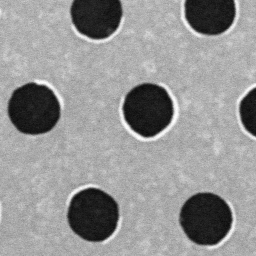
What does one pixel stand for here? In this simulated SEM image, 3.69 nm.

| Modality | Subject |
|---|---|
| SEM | holes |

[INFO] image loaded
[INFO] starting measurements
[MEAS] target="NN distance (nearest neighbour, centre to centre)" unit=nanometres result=419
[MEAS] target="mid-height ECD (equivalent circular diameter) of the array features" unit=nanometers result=194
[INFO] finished